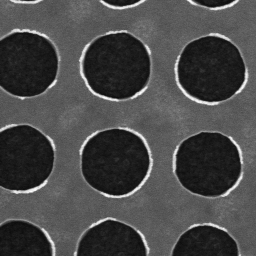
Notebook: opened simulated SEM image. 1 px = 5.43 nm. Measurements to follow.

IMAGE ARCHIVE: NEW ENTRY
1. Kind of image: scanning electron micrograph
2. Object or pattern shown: holes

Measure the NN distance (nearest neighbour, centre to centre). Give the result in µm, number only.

0.509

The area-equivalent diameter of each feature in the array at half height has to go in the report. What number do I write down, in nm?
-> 364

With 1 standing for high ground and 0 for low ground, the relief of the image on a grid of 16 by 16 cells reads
1111111111111111
1111111111111111
0001110001110011
0000100001100001
0000100001100001
0001110001100001
1111111111111111
1111111111111111
0001110001110011
0001100001100001
0001100001100001
0001110001100001
1111111111111111
1111111111111111
0001100001110011
0001100001100001